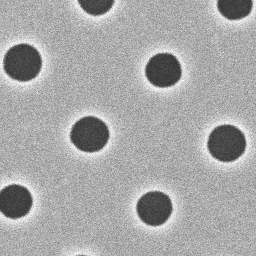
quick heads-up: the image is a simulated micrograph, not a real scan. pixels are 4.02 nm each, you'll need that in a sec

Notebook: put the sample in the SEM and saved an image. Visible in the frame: holes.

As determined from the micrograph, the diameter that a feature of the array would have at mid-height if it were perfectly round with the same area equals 0.154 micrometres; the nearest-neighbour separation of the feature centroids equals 391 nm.